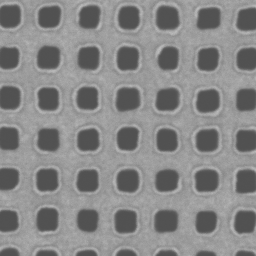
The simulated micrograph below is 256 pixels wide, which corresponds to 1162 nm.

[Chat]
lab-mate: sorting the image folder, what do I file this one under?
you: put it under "a regular array of holes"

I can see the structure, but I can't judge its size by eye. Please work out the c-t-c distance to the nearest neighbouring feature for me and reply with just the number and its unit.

179 nm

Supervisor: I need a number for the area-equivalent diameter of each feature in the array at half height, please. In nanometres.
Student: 104